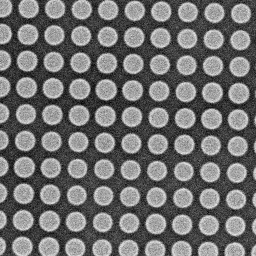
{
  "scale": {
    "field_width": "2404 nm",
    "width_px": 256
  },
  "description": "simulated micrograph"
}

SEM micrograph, an array of small figures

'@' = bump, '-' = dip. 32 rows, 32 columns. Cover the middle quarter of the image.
--@@@@--@@@@@--@@@@@--@@@@--@@@@
---@@@---@@@---@@@@---@@@@---@@@
------------------------------@-
--------------------------------
--@@@@---@@@----@@-----@--------
--@@@@--@@@@@--@@@@---@@@@---@@@
--@@@@--@@@@@--@@@@--@@@@@--@@@@
--@@@@--@@@@@--@@@@---@@@@--@@@@
---@@----@@@----@@@---@@@@---@@@
--------------------------------
--------------------------------
--@@@@--@@@@---@@@@---@@@----@@-
-@@@@@--@@@@@--@@@@---@@@@--@@@@
-@@@@@--@@@@@--@@@@--@@@@@--@@@@
--@@@@--@@@@---@@@@---@@@@--@@@@
----------------@------@@----@@@
--------------------------------
---@@----@@---------------------
--@@@@--@@@@---@@@@---@@@----@@@
-@@@@@--@@@@---@@@@--@@@@@--@@@@
-@@@@@--@@@@---@@@@--@@@@@--@@@@
--@@@----@@@---@@@----@@@---@@@@
------------------------------@-
--------------------------------
--@@@----@@-----@@-----@--------
-@@@@@--@@@@---@@@@--@@@@---@@@@
-@@@@@--@@@@--@@@@@--@@@@---@@@@
--@@@---@@@@---@@@@--@@@@---@@@@
---------@@-----@@----@@@---@@@@
--------------------------------
--------------------------------
-@@@@---@@@@---@@@----@@@----@@-